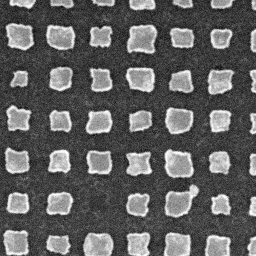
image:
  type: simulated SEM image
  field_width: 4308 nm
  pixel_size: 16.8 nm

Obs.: a regular array of raised bodies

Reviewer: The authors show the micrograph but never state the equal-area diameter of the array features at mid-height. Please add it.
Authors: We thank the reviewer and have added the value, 0.379 microns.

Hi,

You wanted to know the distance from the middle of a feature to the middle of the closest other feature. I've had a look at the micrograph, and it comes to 0.665 µm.